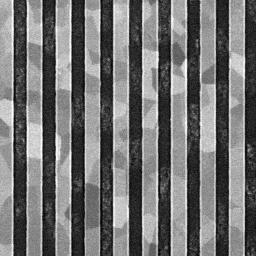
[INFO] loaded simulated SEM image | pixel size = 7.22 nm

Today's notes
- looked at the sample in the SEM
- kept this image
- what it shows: parallel lines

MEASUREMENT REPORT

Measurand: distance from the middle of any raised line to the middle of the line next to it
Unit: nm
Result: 208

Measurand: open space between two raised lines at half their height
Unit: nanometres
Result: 101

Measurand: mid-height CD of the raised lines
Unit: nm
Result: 107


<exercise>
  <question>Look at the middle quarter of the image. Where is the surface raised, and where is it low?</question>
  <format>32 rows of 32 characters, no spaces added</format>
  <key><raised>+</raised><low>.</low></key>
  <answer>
++...++++....+++....+++....+++..
++...++++....+++....+++....+++..
++...++++....+++....+++....+++..
++...++++....+++....+++....+++..
++....+++....+++....+++....+++..
++...++++....+++....+++....+++..
++...++++....+++....+++....+++..
++...++++....+++....+++....+++..
++...++++....+++....+++....+++..
++...++++....+++....+++....+++..
++...++++....+++....+++....+++..
++....+++....+++....+++....+++..
++....+++....+++....+++....+++..
++...++++....+++....+++....+++..
++...++++....+++....+++....+++..
++...++++....+++....+++....+++..
++...++++....+++....+++....+++..
++...++++....+++....+++....+++..
++...++++....+++....+++....+++..
++...++++....+++....+++....+++..
++...++++....+++....+++....+++..
++...++++....+++....+++....+++..
++...++++....+++....+++....+++..
++...++++....+++....+++....+++..
++...++++....+++....+++....+++..
++...++++....+++....+++....+++..
++...++++....+++....+++....+++..
++...++++....+++....+++....+++..
++...++++....+++....+++....+++..
++...++++....+++....+++....+++..
++...++++....+++....+++....+++..
++...++++....+++....+++....+++..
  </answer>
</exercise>